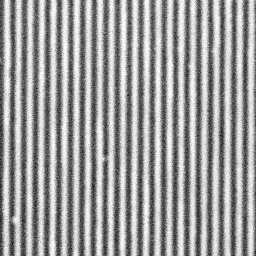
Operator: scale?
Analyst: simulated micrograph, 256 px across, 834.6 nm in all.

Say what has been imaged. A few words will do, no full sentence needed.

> parallel lines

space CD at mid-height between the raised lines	23.2	nanometers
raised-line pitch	37.9	nm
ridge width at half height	0.0147	µm